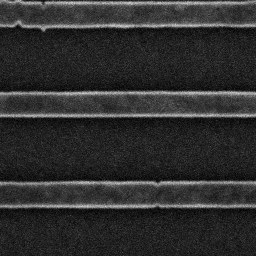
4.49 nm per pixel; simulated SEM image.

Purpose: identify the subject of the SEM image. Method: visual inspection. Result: one or a few lines or trenches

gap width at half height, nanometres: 299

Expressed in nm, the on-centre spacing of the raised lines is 406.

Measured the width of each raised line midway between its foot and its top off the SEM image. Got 0.108 um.